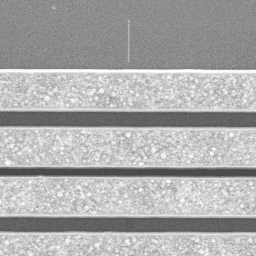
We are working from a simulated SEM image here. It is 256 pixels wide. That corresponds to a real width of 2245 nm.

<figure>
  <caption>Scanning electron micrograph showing parallel lines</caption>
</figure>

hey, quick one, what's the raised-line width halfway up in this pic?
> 350 nm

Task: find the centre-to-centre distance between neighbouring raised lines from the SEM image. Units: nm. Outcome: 464